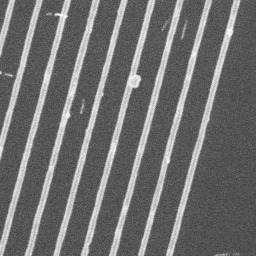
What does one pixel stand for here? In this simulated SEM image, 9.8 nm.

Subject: parallel lines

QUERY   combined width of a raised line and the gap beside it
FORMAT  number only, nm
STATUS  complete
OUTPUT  267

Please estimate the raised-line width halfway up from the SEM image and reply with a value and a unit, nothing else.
47.4 nm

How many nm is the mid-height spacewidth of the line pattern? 216